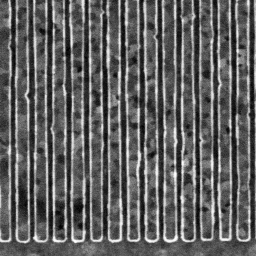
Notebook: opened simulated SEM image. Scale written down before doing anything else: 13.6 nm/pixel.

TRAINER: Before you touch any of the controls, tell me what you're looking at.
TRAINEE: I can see parallel lines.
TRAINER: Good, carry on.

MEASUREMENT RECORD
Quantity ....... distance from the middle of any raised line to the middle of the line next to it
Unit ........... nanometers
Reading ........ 251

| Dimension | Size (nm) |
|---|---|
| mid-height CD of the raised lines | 162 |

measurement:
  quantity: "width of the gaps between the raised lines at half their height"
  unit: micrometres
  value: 0.0902